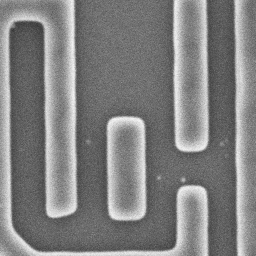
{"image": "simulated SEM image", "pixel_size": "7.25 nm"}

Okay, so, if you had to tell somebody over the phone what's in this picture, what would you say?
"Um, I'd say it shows wiring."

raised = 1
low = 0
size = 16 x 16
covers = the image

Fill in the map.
1111100000011001
1011100000011001
1001100000011001
1001100000011001
1001100000011001
1001100000011001
1001100000011001
1001100110011001
1001100110011001
1001100110000001
1001100110000001
1001100110000001
1001100110011001
1001000110011001
1000000000011001
1100000000011001